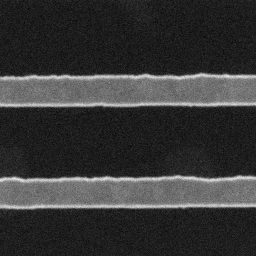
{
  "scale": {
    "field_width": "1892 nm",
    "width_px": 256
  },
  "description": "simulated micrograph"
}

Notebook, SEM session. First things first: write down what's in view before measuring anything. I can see lines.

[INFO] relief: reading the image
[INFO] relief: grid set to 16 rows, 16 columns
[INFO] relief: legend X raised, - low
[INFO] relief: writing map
----------------
----------------
----------------
----------------
----------------
XXXXXXXXXXXXXXXX
XXXXXXXXXXXXXXXX
----------------
----------------
----------------
----------------
XXXXXXXXXXXXXXXX
XXXXXXXXXXXXXXXX
----------------
----------------
----------------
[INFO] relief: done